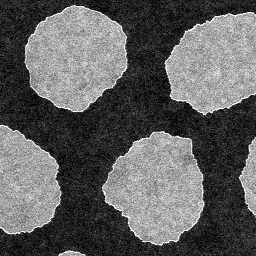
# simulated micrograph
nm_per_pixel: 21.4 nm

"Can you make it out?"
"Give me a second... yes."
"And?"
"raised bodies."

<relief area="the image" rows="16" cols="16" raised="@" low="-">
----@-----------
---@@@@------@@@
--@@@@@@---@@@@@
--@@@@@@---@@@@@
--@@@@@@--@@@@@@
--@@@@@----@@@@@
---@@@------@@@-
----------------
@@-------@@-----
@@@-----@@@@----
@@@@---@@@@@---@
@@@@---@@@@@@--@
@@@@---@@@@@@--@
@@@-----@@@@----
@@------@@@@----
----------------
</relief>